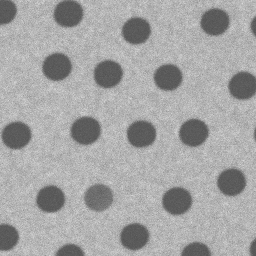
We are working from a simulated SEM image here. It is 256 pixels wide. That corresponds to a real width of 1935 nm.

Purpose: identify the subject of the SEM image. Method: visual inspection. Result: a regular array of holes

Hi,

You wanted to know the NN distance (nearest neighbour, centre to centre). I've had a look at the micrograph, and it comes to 0.398 um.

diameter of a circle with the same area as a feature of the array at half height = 0.215 microns